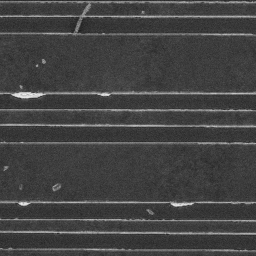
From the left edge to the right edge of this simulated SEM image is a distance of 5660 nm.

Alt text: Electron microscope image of lines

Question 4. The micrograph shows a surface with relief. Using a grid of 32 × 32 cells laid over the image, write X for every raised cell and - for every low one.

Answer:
XXXXXXXXXXXXXXXXXXXXXXXXXXXXXXXX
XXXXXXXXXXXXXXXXXXXXXXXXXXXXXXXX
--------------------------------
--------------------------------
XXXXXXXXXXXXXXXXXXXXXXXXXXXXXXXX
XXXXXXXXXXXXXXXXXXXXXXXXXXXXXXXX
XXXXXXXXXXXXXXXXXXXXXXXXXXXXXXXX
XXXXXXXXXXXXXXXXXXXXXXXXXXXXXXXX
XXXXXXXXXXXXXXXXXXXXXXXXXXXXXXXX
XXXXXXXXXXXXXXXXXXXXXXXXXXXXXXXX
XXXXXXXXXXXXXXXXXXXXXXXXXXXXXXXX
XXXXXXXXXXXXXXXXXXXXXXXXXXXXXXXX
--------------------------------
--------------------------------
XXXXXXXXXXXXXXXXXXXXXXXXXXXXXXXX
XXXXXXXXXXXXXXXXXXXXXXXXXXXXXXXX
--------------------------------
--------------------------------
XXXXXXXXXXXXXXXXXXXXXXXXXXXXXXXX
XXXXXXXXXXXXXXXXXXXXXXXXXXXXXXXX
XXXXXXXXXXXXXXXXXXXXXXXXXXXXXXXX
XXXXXXXXXXXXXXXXXXXXXXXXXXXXXXXX
XXXXXXXXXXXXXXXXXXXXXXXXXXXXXXXX
XXXXXXXXXXXXXXXXXXXXXXXXXXXXXXXX
XXXXXXXXXXXXXXXXXXXXXXXXXXXXXXXX
--XX-----------------XXX--------
--------------------------------
XXXXXXXXXXXXXXXXXX--------------
XXXXXXXXXXXXXXXXXXXXXXXXXXXXXXXX
--------------------------------
--------------------------------
XXXXXXXXXXXXXXXXXXXXXXXXXXXXXXXX